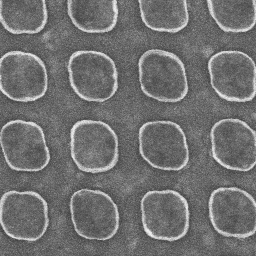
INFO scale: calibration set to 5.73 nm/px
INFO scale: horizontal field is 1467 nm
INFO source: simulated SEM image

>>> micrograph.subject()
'raised bodies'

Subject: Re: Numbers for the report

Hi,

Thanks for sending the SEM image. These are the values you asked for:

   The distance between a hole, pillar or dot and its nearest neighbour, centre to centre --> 393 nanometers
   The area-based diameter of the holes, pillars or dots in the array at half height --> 284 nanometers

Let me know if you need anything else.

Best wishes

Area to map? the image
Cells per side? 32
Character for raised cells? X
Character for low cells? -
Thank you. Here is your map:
XXXXX----XXXXX---XXXXXX---XXXXXX
XXXXXX---XXXXXX---XXXXX---XXXXXX
XXXXXX---XXXXX----XXXXX----XXXXX
-XXXX-----XXXX-----XXX------XXX-
--------------------------------
--------------------------------
----------XX----------------XX--
XXXXX----XXXXX----XXXX----XXXXXX
XXXXXX---XXXXX---XXXXXX---XXXXXX
XXXXXX---XXXXX---XXXXXX---XXXXXX
XXXXXX---XXXXX----XXXXX---XXXXXX
-XXXXX----XXXX----XXXXX----XXXXX
--X-----------------XX----------
--------------------------------
--------------------------------
-XXX------XXX-----XXXX-----XXX--
XXXXX----XXXXX----XXXXX----XXXXX
XXXXX----XXXXX----XXXXX----XXXXX
XXXXXX---XXXXX----XXXXX----XXXXX
-XXXXX---XXXXXX---XXXXX----XXXXX
-XXXXX----XXXX-----XXXX-----XXXX
--------------------------------
--------------------------------
--------------------------------
-XXXX----XXXX-----XXXXX----XXXX-
XXXXXX---XXXXX----XXXXX---XXXXXX
XXXXXX---XXXXXX---XXXXX---XXXXXX
XXXXXX---XXXXXX---XXXXX----XXXXX
XXXXXX---XXXXXX---XXXXX----XXXXX
-XXXX-----XXXX-----XXXX---------
--------------------------------
--------------------------------